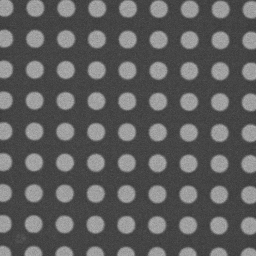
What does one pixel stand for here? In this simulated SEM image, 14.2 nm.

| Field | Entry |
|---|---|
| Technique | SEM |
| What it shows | an array of small figures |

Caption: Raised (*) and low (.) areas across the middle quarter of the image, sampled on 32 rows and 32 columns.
**....****....****....***.....**
***...****....****....****...***
**....****....****....****...***
*......**......**.....***.....**
................................
................................
................................
**.....**......**.....***.....**
**....****....****....***....***
**....****....****...*****...***
**....****....****....***....***
.......................*......**
................................
................................
................................
**.....**.....***.....***.....**
**....****....****...*****...***
**....****....****...*****...***
**.....**.....***.....***....***
................................
................................
................................
................................
**....****....***.....***.....**
**....****....****...****....***
**....****....****...****....***
*......**.....***.....***.....**
................................
................................
................................
*......**......**...............
**....****....****....***....***